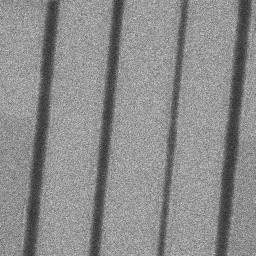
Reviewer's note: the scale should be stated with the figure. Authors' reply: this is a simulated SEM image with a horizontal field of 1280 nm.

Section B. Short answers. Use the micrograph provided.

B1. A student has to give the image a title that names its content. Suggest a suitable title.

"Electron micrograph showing one or a few lines or trenches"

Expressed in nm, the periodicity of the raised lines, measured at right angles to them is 318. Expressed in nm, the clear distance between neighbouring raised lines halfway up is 246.